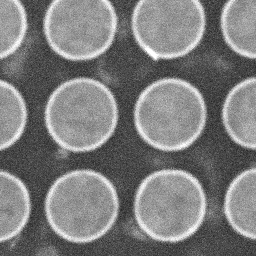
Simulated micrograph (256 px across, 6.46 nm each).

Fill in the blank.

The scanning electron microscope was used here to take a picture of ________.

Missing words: raised bodies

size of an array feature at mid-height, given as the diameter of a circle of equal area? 0.444 um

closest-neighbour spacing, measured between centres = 572 nanometers